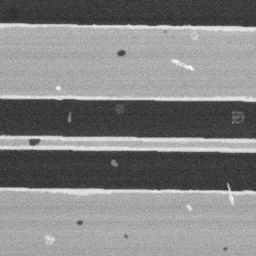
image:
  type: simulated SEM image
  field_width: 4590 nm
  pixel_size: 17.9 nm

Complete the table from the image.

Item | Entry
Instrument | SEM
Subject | lines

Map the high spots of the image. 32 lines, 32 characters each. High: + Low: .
................................
................................
................................
++++++++++++++++++++++++++++++++
++++++++++++++++++++++++++++++++
++++++++++++++++++++++++++++++++
++++++++++++++++++++++++++++++++
++++++++++++++++++++++++++++++++
++++++++++++++++++++++++++++++++
++++++++++++++++++++++++++++++++
++++++++++++++++++++++++++++++++
++++++++++++++++++++++++++++++++
....................+.++++++++++
................................
................................
................................
................................
++++++++++++++++++++++++........
++++++++++++++++++++++++++++++++
................................
................................
................................
................................
................................
++++++++++++++++++++++++++++++++
++++++++++++++++++++++++++++++++
++++++++++++++++++++++++++++++++
++++++++++++++++++++++++++++++++
++++++++++++++++++++++++++++++++
++++++++++++++++++++++++++++++++
++++++++++++++++++++++++++++++++
++++++++++++++++++++++++++++++++